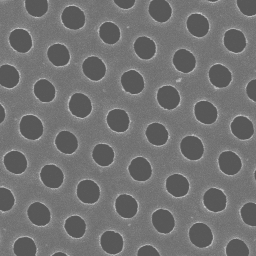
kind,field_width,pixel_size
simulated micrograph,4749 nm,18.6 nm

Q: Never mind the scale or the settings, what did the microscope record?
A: a regular array of holes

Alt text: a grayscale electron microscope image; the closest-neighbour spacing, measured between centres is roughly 707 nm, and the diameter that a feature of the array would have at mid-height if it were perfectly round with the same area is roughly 435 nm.